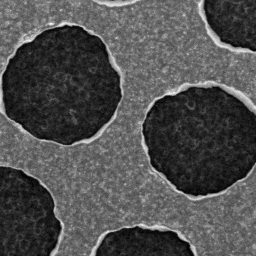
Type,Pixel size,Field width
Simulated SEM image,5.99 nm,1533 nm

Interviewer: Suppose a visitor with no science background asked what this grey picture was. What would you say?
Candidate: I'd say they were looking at holes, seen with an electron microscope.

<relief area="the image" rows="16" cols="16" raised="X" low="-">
XXXXXXXXXXXXX---
XXXXXXXXXXXXX---
XX----XXXXXXXX--
X------XXXXXXXXX
-------XXXXXXXXX
--------XXXX--XX
-------XXX------
X------XX-------
XX----XXX-------
XXXXXXXXX-------
-XXXXXXXXX------
---XXXXXXXX----X
---XXXXXXXXXXXXX
----XXXXXXXXXXXX
----XXX----XXXXX
---XXX------XXXX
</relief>